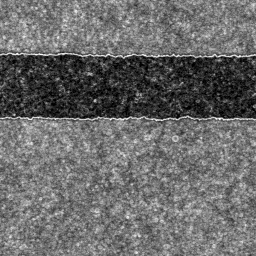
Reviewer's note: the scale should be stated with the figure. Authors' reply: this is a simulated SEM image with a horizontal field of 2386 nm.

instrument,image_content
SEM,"one or a few lines or trenches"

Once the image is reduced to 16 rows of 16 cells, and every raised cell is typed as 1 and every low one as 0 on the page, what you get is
0000000000000000
0000000000000000
0000000000000000
1111111011110101
1111111111111111
1111111111111111
1111111111111111
0000000000000000
0000000000000000
0000000000000000
0000000000000000
0000000000000000
0000000000000000
0000000000000000
0000000000000000
0000000000000000